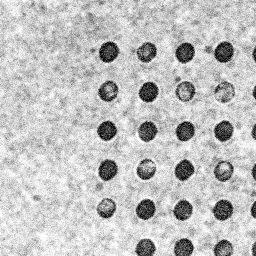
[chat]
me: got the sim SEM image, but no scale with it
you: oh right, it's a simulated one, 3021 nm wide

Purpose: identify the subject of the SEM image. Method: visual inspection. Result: a regular array of holes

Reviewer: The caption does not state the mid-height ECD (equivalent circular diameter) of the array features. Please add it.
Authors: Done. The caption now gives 21.9 px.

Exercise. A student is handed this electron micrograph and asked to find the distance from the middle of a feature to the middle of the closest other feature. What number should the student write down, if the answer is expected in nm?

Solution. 449